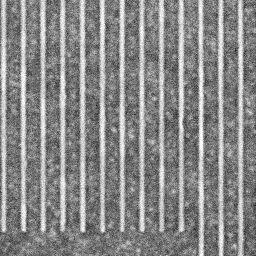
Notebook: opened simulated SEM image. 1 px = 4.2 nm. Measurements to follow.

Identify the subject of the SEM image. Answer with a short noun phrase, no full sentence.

parallel lines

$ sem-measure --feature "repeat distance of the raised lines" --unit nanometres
83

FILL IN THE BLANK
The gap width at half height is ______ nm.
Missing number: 66.7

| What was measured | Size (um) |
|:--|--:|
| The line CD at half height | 0.0158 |